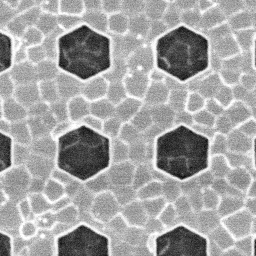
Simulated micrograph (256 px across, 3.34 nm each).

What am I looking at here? holes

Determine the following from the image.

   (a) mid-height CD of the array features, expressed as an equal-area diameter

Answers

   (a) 178 nanometres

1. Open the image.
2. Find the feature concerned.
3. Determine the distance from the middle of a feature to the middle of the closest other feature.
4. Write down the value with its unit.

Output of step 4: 329 nanometres